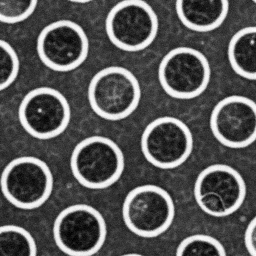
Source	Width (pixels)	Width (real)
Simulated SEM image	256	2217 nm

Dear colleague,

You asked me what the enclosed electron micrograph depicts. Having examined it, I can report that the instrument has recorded a regular array of raised bodies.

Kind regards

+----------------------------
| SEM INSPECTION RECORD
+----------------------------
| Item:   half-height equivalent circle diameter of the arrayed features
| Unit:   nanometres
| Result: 402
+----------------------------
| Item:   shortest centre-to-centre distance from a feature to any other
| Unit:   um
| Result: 0.61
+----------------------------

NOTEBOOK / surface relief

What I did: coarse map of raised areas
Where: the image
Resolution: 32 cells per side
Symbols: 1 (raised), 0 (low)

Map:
11110000000000011100001111110000
11110000000000111110001111110000
01000000000000111110000111110000
00000011110000111110000001000000
00000111110000111110000000000011
00000111111000011100000000000111
10000111111000000000001100000111
11000011110000000000011110000111
11000001000000000000111111000011
11000000000011110000111111000001
10000000000011111000011111000000
00001100000111111000011110000000
00011111000111111000000000000100
00011111000011110000000000011111
00011111000001100000000000011111
00011111000000000001110000011111
00001110000000000011111000011111
00000000000110000011111100001110
00000000001111000011111100000000
00000000011111100011111000000000
00111000011111100000110000000000
01111100011111100000000000111000
11111100001111000000000001111100
01111100000000000000000001111100
01111100000000001111100001111100
00111000000000001111100001111100
00000000111100001111100000110000
00000001111110001111100000000000
00000001111110000111000000000001
11100001111110000000000000000001
11110001111100000000000111100001
11110000011000000000001111110000